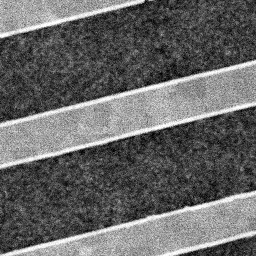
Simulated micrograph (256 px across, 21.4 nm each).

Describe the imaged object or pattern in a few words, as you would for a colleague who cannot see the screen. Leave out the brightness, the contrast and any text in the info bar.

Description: one or a few lines or trenches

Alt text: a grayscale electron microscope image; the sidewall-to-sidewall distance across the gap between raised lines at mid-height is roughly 1840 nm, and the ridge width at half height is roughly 865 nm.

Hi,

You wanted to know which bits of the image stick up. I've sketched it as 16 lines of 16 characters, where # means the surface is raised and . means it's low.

#######.........
###.............
................
................
.............###
.........#######
.....###########
.###########....
########........
####............
................
................
..............##
..........######
......##########
..##########....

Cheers